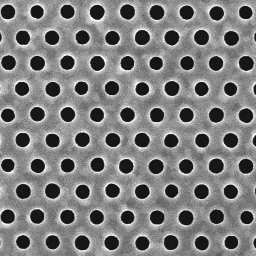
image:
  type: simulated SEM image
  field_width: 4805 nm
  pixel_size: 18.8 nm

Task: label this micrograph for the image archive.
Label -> a regular array of holes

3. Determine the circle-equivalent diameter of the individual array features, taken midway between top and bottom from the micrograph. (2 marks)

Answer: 274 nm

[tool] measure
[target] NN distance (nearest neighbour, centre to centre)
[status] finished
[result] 0.545 um